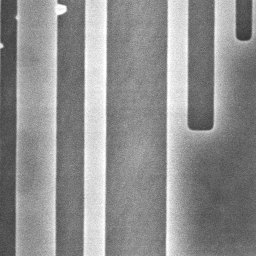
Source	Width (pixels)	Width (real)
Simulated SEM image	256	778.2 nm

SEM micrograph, groups of lines, slits or small figures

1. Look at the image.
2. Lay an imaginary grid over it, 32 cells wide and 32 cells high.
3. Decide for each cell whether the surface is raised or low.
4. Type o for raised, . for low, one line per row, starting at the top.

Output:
..ooooo....oo........oo....oo...
..oooooo...oo........oo....oo...
..ooooo....oo........oo....oo...
..ooooo....oo........oo....oo...
..ooooo....oo........oo....ooo.o
..ooooo....oo........oo....ooooo
..ooooo....oo........oo....ooooo
..ooooo....oo........oo....ooooo
..ooooo....oo........oo....ooooo
..ooooo....oo........oo....ooooo
..ooooo....oo........oo....ooooo
..ooooo....oo........oo....ooooo
..ooooo....oo........oo....ooooo
..ooooo....oo........oo....ooooo
..ooooo....oo........oo....ooooo
..ooooo....oo........oo....ooooo
..ooooo....oo........ooooooooooo
..ooooo....oo........ooooooooooo
..ooooo....oo........ooooooooooo
..ooooo....oo........ooooooooooo
..ooooo....oo........ooooooooooo
..ooooo....oo........ooooooooooo
..ooooo....oo........ooooooooooo
..ooooo....oo........ooooooooooo
..ooooo....oo........ooooooooooo
..ooooo....oo........ooooooooooo
..ooooo....oo........ooooooooooo
..ooooo....oo........ooooooooooo
..ooooo....oo........ooooooooooo
..ooooo....oo........ooooooooooo
..ooooo....oo........ooooooooooo
..ooooo....oo........ooooooooooo